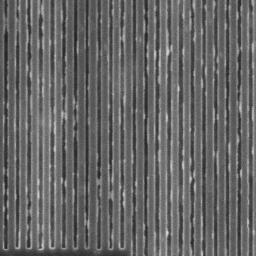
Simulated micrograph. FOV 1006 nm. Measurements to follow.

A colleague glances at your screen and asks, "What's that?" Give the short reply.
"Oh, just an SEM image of parallel lines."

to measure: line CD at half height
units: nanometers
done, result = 31.9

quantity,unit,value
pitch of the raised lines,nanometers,45.7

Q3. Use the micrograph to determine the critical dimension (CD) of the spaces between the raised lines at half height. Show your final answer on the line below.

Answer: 14.2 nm